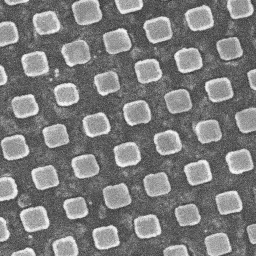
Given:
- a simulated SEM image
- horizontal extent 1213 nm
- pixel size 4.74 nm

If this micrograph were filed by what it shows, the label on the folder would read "a regular array of raised bodies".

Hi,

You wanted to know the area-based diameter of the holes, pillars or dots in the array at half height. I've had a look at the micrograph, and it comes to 119 nanometres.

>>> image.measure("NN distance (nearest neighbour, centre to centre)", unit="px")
42.2